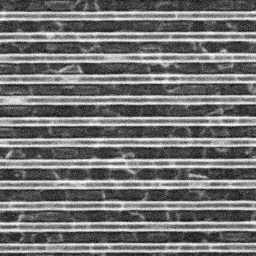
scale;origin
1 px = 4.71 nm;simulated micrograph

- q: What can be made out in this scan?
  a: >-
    parallel lines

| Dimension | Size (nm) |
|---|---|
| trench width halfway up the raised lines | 60.7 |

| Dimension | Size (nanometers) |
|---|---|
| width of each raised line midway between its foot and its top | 36.5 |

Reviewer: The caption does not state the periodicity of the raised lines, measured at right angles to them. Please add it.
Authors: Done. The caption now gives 21.1 px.